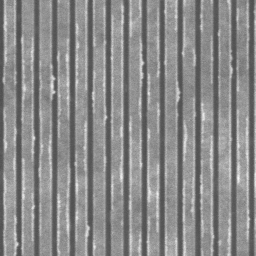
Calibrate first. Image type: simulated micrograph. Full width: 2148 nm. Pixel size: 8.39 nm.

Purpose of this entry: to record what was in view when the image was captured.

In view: parallel lines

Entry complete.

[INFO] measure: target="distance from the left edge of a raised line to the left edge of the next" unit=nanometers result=150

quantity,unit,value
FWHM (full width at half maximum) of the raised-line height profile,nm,98.6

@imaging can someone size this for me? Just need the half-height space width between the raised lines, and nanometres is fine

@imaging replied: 49.3